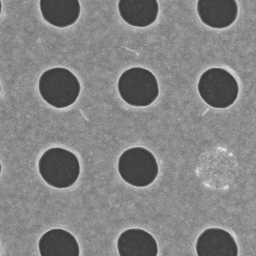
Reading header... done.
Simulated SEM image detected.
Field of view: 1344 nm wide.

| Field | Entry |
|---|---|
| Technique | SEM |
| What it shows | holes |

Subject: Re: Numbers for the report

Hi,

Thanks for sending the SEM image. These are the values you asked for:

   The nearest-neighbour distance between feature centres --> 416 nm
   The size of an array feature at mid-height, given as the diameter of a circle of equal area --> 208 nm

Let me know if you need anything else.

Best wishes